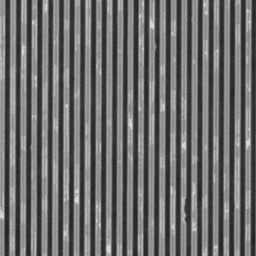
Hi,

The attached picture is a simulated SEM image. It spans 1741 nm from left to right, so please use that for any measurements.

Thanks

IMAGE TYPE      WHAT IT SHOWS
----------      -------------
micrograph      parallel lines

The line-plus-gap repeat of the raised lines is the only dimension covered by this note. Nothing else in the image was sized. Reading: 0.0728 µm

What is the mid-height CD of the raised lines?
31.5 nanometers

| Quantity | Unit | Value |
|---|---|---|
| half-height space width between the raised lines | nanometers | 37.4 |